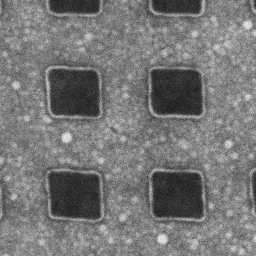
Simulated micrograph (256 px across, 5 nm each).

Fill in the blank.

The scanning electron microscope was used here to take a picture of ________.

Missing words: raised bodies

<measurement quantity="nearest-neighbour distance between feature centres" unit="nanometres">511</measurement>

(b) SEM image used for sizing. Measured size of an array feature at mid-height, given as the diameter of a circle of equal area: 0.29 um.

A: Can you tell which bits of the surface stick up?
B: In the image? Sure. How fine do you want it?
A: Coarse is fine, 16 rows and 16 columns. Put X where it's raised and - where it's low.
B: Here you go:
---XXX----XXX---
----------------
----------------
----------------
---XXX---XXX----
---XXX---XXXX---
---XXX---XXXX---
----------------
----------------
----------------
----------------
---XXX---XXXX---
---XXX---XXXX---
---XXX----XXX---
----------------
----------------